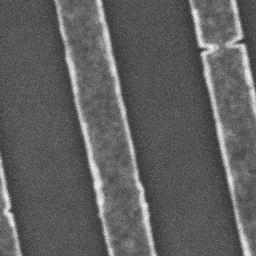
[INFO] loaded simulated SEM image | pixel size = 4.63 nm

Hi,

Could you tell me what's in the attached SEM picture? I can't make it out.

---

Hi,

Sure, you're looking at one or a few lines or trenches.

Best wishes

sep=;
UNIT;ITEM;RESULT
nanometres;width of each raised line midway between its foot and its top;202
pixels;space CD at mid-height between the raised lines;88.1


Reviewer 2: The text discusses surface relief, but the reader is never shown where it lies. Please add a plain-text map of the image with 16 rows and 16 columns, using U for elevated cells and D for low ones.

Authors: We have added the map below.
DDDDUUDDDDDDUUUD
DDDDUUUDDDDDUUUD
DDDDUUUDDDDDUUUD
DDDDUUUDDDDDDUUD
DDDDUUUDDDDDDUUU
DDDDDUUDDDDDDUUU
DDDDDUUUDDDDDUUU
DDDDDUUUDDDDDDUU
DDDDDUUUDDDDDDUU
DDDDDDUUDDDDDDUU
DDDDDDUUDDDDDDUU
DDDDDDUUUDDDDDUU
DDDDDDUUUDDDDDDU
UDDDDDUUUDDDDDDU
UDDDDDDUUDDDDDDU
UDDDDDDUUUDDDDDU